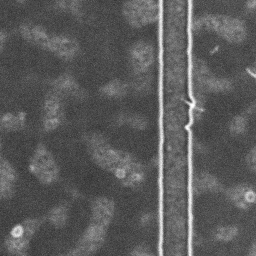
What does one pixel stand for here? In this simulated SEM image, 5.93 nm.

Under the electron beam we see one or a few lines or trenches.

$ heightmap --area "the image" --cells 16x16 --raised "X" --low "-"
XXXXXXXXXX--XXXX
XXXXXXXXXX--XXXX
XXXXXXXXXX--XXXX
XXXXXXXXXX--XXXX
XXXXXXXXXX--XXXX
XXXXXXXXXX--XXXX
XXXXXXXXXX--XXXX
XXXXXXXXXX--XXXX
XXXXXXXXXX--XXXX
XXXXXXXXXX--XXXX
XXXXXXXXXX--XXXX
XXXXXXXXXX--XXXX
XXXXXXXXXX--XXXX
XXXXXXXXXX--XXXX
XXXXXXXXXX--XXXX
XXXXXXXXXX--XXXX